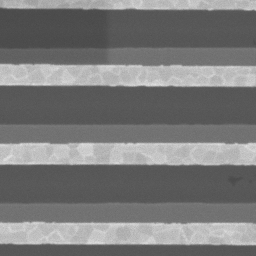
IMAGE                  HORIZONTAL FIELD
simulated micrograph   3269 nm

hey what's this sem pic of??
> lines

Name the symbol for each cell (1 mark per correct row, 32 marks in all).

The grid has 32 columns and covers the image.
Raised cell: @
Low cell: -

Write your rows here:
@@@@@@@@@@@@@@@@@@@@@@@@@@@@@@@@
--------------------------------
--------------------------------
--------------------------------
--------------------------------
--------------------------------
@@@@@@@@@@@@@@@@@@@@@@@@@@@@@@@@
@@@@@@@@@@@@@@@@@@@@@@@@@@@@@@@@
@@@@@@@@@@@@@@@@@@@@@@@@@@@@@@@@
@@@@@@@@@@@@@@@@@@@@@@@@@@@@@@@@
@@@@@@@@@@@@@@@@@@@@@@@@@@@@@@@@
--------------------------------
--------------------------------
--------------------------------
--------------------------------
--------------------------------
@@@@@@@@@@@@@@@@@@@@@@@@@@@@@@@@
@@@@@@@@@@@@@@@@@@@@@@@@@@@@@@@@
@@@@@@@@@@@@@@@@@@@@@@@@@@@@@@@@
@@@@@@@@@@@@@@@@@@@@@@@@@@@@@@@@
--------@---------@@-@@@-@@@-@@@
--------------------------------
--------------------------------
--------------------------------
--------------------------------
----------@--@@@@@--@@@@@@---@--
@@@@@@@@@@@@@@@@@@@@@@@@@@@@@@@@
@@@@@@@@@@@@@@@@@@@@@@@@@@@@@@@@
@@@@@@@@@@@@@@@@@@@@@@@@@@@@@@@@
@@@@@@@@@@@@@@@@@@@@@@@@@@@@@@@@
-----------------------@-@@@@@@@
--------------------------------